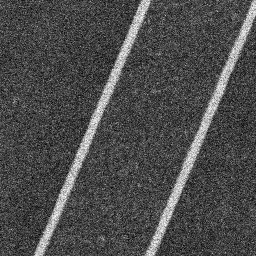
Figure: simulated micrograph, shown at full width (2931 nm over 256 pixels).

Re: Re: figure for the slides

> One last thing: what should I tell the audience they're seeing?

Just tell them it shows one or a few lines or trenches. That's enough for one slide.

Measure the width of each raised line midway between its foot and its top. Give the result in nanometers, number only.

1170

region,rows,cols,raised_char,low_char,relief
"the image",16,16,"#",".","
.........#######
.........######.
........#######.
........#######.
.......#######..
.......#######..
......#######...
......#######...
......#######...
.....#######....
.....#######....
....#######.....
....#######.....
...#######......
...#######......
...#######......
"